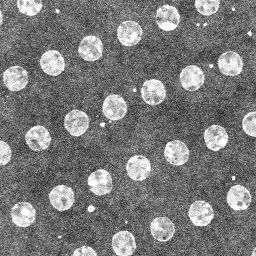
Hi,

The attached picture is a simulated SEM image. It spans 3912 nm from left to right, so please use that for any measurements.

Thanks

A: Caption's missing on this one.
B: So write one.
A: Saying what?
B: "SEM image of a regular array of raised bodies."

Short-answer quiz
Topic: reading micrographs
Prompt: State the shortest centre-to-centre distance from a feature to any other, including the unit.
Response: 626 nanometers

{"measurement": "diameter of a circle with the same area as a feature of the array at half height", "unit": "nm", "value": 366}